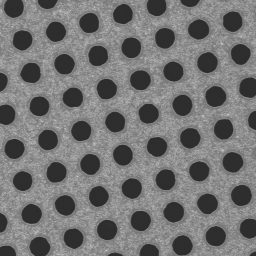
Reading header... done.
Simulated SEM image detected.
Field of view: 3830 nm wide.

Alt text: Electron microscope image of a regular array of holes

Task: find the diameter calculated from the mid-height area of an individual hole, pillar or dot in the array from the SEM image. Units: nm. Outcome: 299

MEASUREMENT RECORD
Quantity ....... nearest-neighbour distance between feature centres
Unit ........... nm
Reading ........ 506